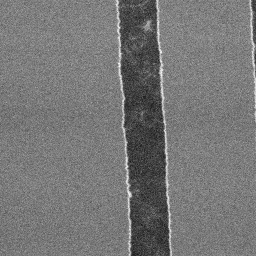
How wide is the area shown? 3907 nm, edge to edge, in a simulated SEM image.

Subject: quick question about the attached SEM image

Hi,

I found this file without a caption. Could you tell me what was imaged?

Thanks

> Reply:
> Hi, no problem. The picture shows one or a few lines or trenches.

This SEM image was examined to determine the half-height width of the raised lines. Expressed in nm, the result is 614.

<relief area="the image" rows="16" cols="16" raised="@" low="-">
-------@@@------
-------@@@------
-------@@@------
-------@@@------
-------@@@------
--------@@------
--------@@------
--------@@------
--------@@------
--------@@------
--------@@------
--------@@------
--------@@------
--------@@@-----
--------@@@-----
--------@@@-----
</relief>